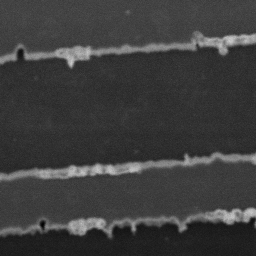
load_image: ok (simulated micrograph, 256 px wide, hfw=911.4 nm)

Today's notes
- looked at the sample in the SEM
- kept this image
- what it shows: one or a few lines or trenches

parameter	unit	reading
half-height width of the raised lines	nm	211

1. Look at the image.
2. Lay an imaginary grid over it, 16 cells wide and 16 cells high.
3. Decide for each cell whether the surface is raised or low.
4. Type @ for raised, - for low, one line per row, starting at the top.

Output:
@@@@@@@@@@@@@@@@
@@@@@@@@@@@@@@@@
@@@@@@@@@@@@@@@@
@-@@@@----------
----------------
----------------
----------------
----------------
----------------
----------------
----@@@@@@@@@@@@
@@@@@@@@@@@@@@@@
@@@@@@@@@@@@@@@@
@@@@@@@@@@@@@@@@
@---------------
----------------